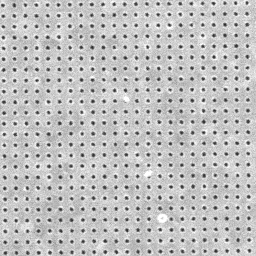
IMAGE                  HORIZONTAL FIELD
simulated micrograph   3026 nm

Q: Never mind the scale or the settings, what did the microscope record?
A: a regular array of holes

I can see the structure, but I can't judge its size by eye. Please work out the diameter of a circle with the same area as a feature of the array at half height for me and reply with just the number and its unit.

51.7 nanometers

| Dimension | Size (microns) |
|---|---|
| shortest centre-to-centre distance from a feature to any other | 0.126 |